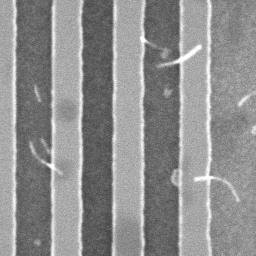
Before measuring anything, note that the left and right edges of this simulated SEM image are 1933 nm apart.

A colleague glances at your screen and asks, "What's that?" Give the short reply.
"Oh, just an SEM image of lines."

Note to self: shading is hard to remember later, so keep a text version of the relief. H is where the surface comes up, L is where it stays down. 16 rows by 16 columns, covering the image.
HLLHHLLHHLLHHLLL
HLLHHLLHHLLHHLLL
HLLHHLLHHLLHHLLL
HLLHHLLHHLLHHLLL
HLLHHLLHHLLHHLLL
HLLHHLLHHLLHHLLL
HLLHHLLHHLLHHLLL
HLLHHLLHHLLHHLLL
HLLHHLLHHLLHHLLL
HLLHHLLHHLLHHLLL
HLLHHLLHHLLHHLLL
HLLHHLLHHLLHHLLL
HLLHHLLHHLLHHLLL
HLLHHLLHHLLHHLLL
HLLHHLLHHLLHHLLL
HLLHHLLHHLLHHLLL